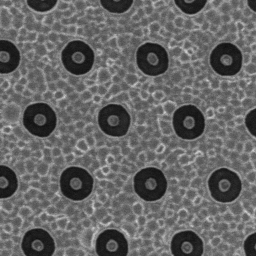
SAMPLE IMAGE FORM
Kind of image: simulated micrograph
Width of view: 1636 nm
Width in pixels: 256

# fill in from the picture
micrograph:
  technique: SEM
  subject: a regular array of ring-shaped grooves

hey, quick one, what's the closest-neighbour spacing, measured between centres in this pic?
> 464 nanometres